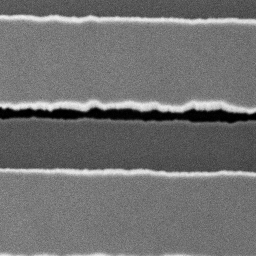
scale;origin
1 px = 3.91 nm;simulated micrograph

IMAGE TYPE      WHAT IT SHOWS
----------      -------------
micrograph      lines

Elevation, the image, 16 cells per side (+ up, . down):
................
++++++++++++++++
++++++++++++++++
++++++++++++++++
++++++++++++++++
++++++++++++++++
++++++++++++++++
................
................
................
................
++++++++++++++++
++++++++++++++++
++++++++++++++++
++++++++++++++++
++++++++++++++++